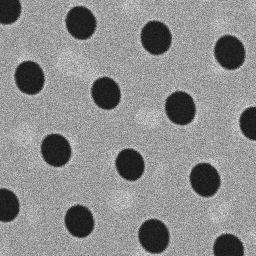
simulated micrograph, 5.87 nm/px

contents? a regular array of holes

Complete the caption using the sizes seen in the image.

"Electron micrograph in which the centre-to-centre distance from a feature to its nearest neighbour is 74.8 pixels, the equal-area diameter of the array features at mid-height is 32.6 pixels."